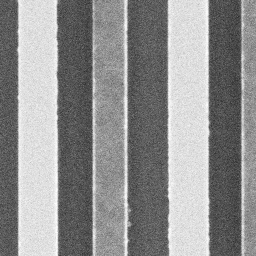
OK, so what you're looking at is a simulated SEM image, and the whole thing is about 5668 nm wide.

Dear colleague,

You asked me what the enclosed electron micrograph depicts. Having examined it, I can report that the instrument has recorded lines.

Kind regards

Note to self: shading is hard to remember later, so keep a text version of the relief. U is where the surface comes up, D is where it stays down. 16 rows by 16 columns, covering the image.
DUUDDDUUDDDUUDDU
DUUDDDUUDDDUUDDU
DUUDDDUUDDDUUDDU
DUUDDDUUDDDUUDDU
DUUDDDUUDDDUUDDU
DUUDDDUUDDDUUDDU
DUUDDDUUDDDUUDDU
DUUDDDUUDDDUUDDU
DUUUDDUUDDDUUDDU
DUUUDDUUDDDUUDDU
DUUUDDUUDDDUUDDU
DUUUDDUUDDDUUDDU
DUUUDDUUDDDUUDDU
DUUUDDUUDDDUUDDU
DUUUDDUUDDDUUDDU
DUUUDDUUDDDUUDDU